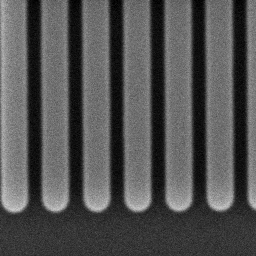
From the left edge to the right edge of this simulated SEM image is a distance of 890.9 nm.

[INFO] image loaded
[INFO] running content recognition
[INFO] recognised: groups of lines, slits or small figures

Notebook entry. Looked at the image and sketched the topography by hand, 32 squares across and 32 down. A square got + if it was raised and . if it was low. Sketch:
+++..+++..++++..+++..+++..+++..+
+++..+++..++++..+++..+++..+++..+
+++..+++..++++..+++..+++..+++..+
+++..+++..++++..+++..+++..+++..+
+++..+++..++++..+++..+++..+++..+
+++..+++..++++..+++..+++..+++..+
+++..+++..++++..+++..+++..+++..+
+++..+++..++++..+++..+++..+++..+
+++..+++..++++..+++..+++..+++..+
+++..+++..++++..+++..+++..+++..+
+++..+++..++++..+++..+++..+++..+
+++..+++..++++..+++..+++..+++..+
+++..+++..++++..+++..+++..+++..+
+++..+++..++++..+++..+++..+++..+
+++..+++..++++..+++..+++..+++..+
+++..+++..++++..+++..+++..+++..+
+++..+++...+++..+++..+++..+++..+
+++..+++...+++..+++..+++..+++..+
+++..+++...+++..+++..+++..+++..+
+++..+++...+++..+++..+++..+++..+
+++..+++...+++..+++..+++..+++..+
+++..+++...+++..+++..+++..+++..+
+++..+++...+++..+++..+++..+++..+
+++..+++...+++..+++..+++..+++..+
+++..+++...+++..+++..+++..+++..+
+++...++...++...+++..+++..+++..+
................................
................................
................................
................................
................................
................................